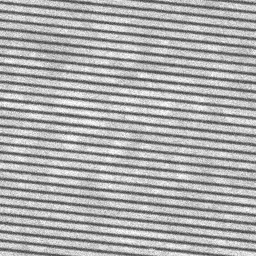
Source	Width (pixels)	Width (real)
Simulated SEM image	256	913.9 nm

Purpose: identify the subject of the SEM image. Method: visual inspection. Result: parallel lines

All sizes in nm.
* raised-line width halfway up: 17.3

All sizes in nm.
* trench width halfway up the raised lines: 13.7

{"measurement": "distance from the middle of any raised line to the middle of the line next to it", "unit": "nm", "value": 31.2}